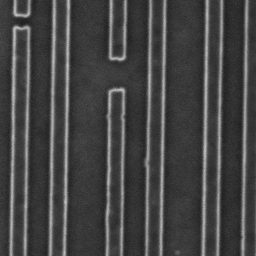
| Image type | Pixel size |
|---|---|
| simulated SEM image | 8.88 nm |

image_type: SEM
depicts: parallel lines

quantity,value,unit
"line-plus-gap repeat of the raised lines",429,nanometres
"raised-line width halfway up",0.125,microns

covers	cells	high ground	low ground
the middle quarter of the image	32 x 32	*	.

*.....................***.......
*.....................***.......
*.....................***.......
*.....................***.......
*....................****.......
*....................****.......
*.............*......****.......
*...........***......****.......
*..........****......****.......
*..........****......****.......
*..........****......****.......
*..........****......****.......
*..........****......****.......
*..........****......****.......
*..........****......****.......
*..........****......****.......
*..........****......****.......
*..........****......****.......
...........****......****.......
...........****......****.......
...........****......****.......
...........****......****.......
...........****......***........
...........****......***........
...........****......***........
...........****......***........
...........***.......***........
...........***.......***........
...........***.......***........
...........***.......***........
...........***.......***........
...........***.......***........